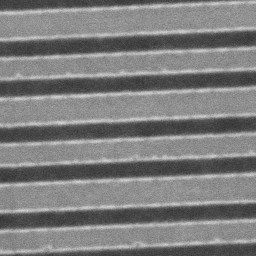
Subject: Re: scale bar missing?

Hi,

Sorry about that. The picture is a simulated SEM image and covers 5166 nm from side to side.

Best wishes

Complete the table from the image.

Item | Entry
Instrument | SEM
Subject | lines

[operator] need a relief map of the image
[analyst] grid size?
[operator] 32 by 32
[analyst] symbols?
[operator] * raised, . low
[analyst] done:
***************************.....
****............................
................................
................................
..........**********************
********************************
*******************.............
................................
................................
..........**********************
********************************
*********************...........
................................
................................
............................****
.....***************************
********************************
***************.................
................................
.............................***
......**************************
********************************
****************................
................................
................................
........................********
********************************
********************************
***********.....................
................................
......................**********
.*******************************